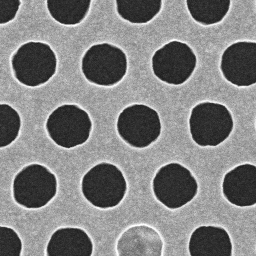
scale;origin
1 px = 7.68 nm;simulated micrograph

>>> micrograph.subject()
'a regular array of holes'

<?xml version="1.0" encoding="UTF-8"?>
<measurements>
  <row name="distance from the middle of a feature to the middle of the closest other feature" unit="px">69.8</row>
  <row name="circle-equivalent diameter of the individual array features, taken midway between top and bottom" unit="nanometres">337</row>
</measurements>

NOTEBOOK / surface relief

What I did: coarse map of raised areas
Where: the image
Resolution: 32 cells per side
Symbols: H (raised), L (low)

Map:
LLLHHHLLLLLHHHHLLLLLHHHLLLLLLHHH
LLHHHHLLLLLHHHHLLLLLHHHHLLLLHHHH
LHHHHHHLLLHHHHHHLLLHHHHHLLLLHHHH
HHHHHHHHHHHHHHHHHHHHHHHHHHHHHHHH
HHHHHHHHHHHHHHHHHHHHHHHHHHHHHHHH
HHHLLLHHHHHHHLHHHHHHHLLHHHHHHLLL
HHLLLLLHHHHLLLLHHHHLLLLLHHHHLLLL
HHLLLLLHHHLLLLLLHHHLLLLLHHHHLLLL
HHLLLLLHHHLLLLLLHHHLLLLLHHHHLLLL
HHLLLLHHHHHLLLLLHHHHLLLLHHHHLLLL
HHHLLHHHHHHHLLHHHHHHHLHHHHHHHLLL
HHHHHHHHHHHHHHHHHHHHHHHHHHHHHHHH
HHHHHHHHHHHHHHHHHHHHHHHHHHHHHHHH
LLHHHHHLLLHHHHHHLLLHHHHHLLLLHHHH
LLHHHHLLLLLHHHHLLLLLHHHHLLLLLHHH
LLHHHHLLLLLHHHHLLLLLHHHHLLLLLHHH
LLHHHHLLLLLHHHHLLLLLHHHHLLLLLHHH
LLHHHHHLLLLHHHHLLLLHHHHHLLLLHHHH
HHHHHHHHHHHHHHHHHHHHHHHHHHHHHHHH
HHHHHHHHHHHHHHHHHHHHHHHHHHHHHHHH
HHHHLHHHHHHHLLHHHHHHHLHHHHHHHHHH
HHLLLLHHHHHLLLLHHHHHLLLLHHHHHLLL
HHLLLLLHHHLLLLLLHHHLLLLLHHHHLLLL
HHLLLLLHHHLLLLLLHHHLLLLLLHHHLLLL
HHLLLLLHHHHLLLLHHHHHLLLLHHHHLLLL
HHLLLLHHHHHHLLLHHHHHLLLHHHHHHLLL
HHHHHHHHHHHHHHHHHHHHHHHHHHHHHHHH
HHHHHHHHHHHHHHHHHHHHHHHHHHHHHHHH
LHHHHHHHLHHHHHHHHHHHHHHHHLLLHHHH
LLHHHHLLLLLHHHHHHHHHHHHHLLLLLHHH
LLLHHHLLLLLLHHHHHLHHHHHHLLLLLHHH
LLLHHHLLLLLLHHHHHLHHHHHHLLLLLHHH